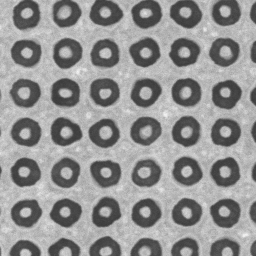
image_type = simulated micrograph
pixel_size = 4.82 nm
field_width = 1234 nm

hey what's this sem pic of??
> a regular array of ring-shaped grooves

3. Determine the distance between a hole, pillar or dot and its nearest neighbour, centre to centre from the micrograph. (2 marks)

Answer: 0.186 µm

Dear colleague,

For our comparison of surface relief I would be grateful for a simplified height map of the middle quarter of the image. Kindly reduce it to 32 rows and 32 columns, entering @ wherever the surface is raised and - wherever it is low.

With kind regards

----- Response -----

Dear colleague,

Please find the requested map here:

--@@@@@------@@@@@@---@@@@@@--@@
@@@@@@@@@@@@@@@@@@@@@@@@@@@@@@@@
@@@@@@@@@@@@@@@@@@@@@@@@@@@@@@@@
-@@@@@@@----@@@@@@---@@@@@@@@@@-
---@@@@------@@@@-------@@@@----
----@@@-------@@@-------@@@-----
@---@@---@@---@@@--@@@---@@---@-
@@--@@---@@@--@@@--@@@--@@@---@@
----@@@--@@---@@@--@@--@@@@-----
----@@@------@@@@------@@@@@----
---@@@@@@--@@@@@@@----@@@@@@@---
@@@@@@@@@@@@@@@@@@@@@@@@@@@@@@@@
@@@@@@@@@@@@@@@@@@@@@@@@@@@@@@@@
-@@@@@@@@@@@@@@@@@@---@@@@@@@---
---@@@@@@----@@@@@------@@@@----
----@@@-------@@--------@@@-----
@---@@---@@@--@@----@@---@@---@-
@----@---@@@--@@----@---@@@--@@-
----@@---@@---@@@------@@@@-----
----@@@------@@@@@----@@@@@@----
@@@@@@@@----@@@@@@@@-@@@@@@@@@--
@@@@@@@@@@@@@@@@@@@@@@@@@@@@@@@@
@@@@@@@@@@@@@@@@@@@@@@@@@@@@@@@@
--@@@@@@@@@@@@@@@@@@@-@@@@@@@---
---@@@@------@@@@@-----@@@@@----
----@@--------@@@-------@@@-----
@@--@@---@@---@@@--@@----@@--@@@
@@--@@@--@@@--@@@--@@----@@--@@@
@@--@@@-------@@---@----@@@-----
---@@@@-------@@@-------@@@@----
--@@@@@@-----@@@@@@----@@@@@@---
@@@@@@@@@@@@@@@@@@@@@@@@@@@@@@@@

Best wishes